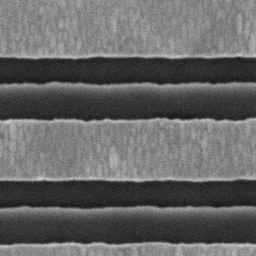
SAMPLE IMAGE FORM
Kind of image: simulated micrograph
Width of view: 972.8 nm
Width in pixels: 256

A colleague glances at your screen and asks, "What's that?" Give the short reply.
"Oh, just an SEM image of lines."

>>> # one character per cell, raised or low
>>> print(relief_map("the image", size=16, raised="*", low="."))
****************
****************
****************
****************
................
................
................
.*..*....****..*
****************
****************
****************
................
................
................
................
****************